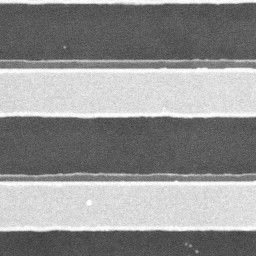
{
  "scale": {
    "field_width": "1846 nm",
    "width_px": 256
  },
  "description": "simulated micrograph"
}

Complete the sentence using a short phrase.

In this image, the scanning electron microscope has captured lines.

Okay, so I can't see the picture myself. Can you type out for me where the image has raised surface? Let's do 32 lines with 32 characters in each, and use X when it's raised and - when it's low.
--------------------------------
--------------------------------
--------------------------------
--------------------------------
--------------------------------
--------------------------------
--------------------------------
--------------------------------
XXXXXXXXXXXXXXXXXXXXXXXXXXXXXXXX
XXXXXXXXXXXXXXXXXXXXXXXXXXXXXXXX
XXXXXXXXXXXXXXXXXXXXXXXXXXXXXXXX
XXXXXXXXXXXXXXXXXXXXXXXXXXXXXXXX
XXXXXXXXXXXXXXXXXXXXXXXXXXXXXXXX
XXXXXXXXXXXXXXXXXXXXXXXXXXXXXXXX
X--------XXXXXXX-----XXXXXX---X-
--------------------------------
--------------------------------
--------------------------------
--------------------------------
--------------------------------
--------------------------------
--------------------------------
XXXXXXXXXXXXXXXXXXXXXXXXXXXXXXXX
XXXXXXXXXXXXXXXXXXXXXXXXXXXXXXXX
XXXXXXXXXXXXXXXXXXXXXXXXXXXXXXXX
XXXXXXXXXXXXXXXXXXXXXXXXXXXXXXXX
XXXXXXXXXXXXXXXXXXXXXXXXXXXXXXXX
XXXXXXXXXXXXXXXXXXXXXXXXXXXXXXXX
XXXXXXXXXXXXXXXXXXXXXXXXXXXXXXXX
--------------------------------
--------------------------------
--------------------------------